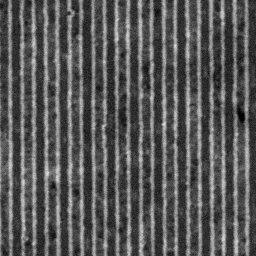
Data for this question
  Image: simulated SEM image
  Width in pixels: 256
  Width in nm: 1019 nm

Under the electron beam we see parallel lines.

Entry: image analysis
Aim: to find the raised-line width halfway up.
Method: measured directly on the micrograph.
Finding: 47.3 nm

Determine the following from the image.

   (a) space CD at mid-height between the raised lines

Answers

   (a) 47.3 nanometers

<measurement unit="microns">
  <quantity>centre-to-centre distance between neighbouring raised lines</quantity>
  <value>0.0942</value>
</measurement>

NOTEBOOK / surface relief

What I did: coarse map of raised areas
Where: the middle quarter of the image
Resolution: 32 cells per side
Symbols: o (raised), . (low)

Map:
.ooo....oo...ooo...ooo...ooo...o
.ooo....oo...ooo...ooo...ooo...o
..oo...ooo...ooo...ooo...ooo...o
..oo...ooo...ooo...ooo...ooo...o
.ooo...ooo...ooo...ooo...ooo...o
.ooo...ooo...ooo...ooo...ooo...o
.ooo...ooo...ooo...ooo...ooo...o
.ooo...ooo...ooo...ooo...ooo...o
.ooo...ooo...ooo...ooo...ooo...o
.ooo...ooo...ooo...ooo...ooo...o
.ooo...ooo...ooo...ooo...ooo...o
.ooo...ooo...ooo...ooo...ooo...o
.ooo...ooo...ooo...ooo...ooo...o
..oo...ooo...ooo...ooo...ooo...o
.ooo...ooo...ooo...ooo...ooo...o
..oo...ooo...ooo...ooo...ooo...o
.ooo...ooo...ooo...ooo...ooo...o
.ooo...ooo...ooo...ooo...ooo...o
.ooo...ooo...ooo...ooo...ooo...o
.ooo...ooo...ooo...ooo...ooo...o
..oo...ooo...ooo...ooo...ooo...o
.ooo...ooo...ooo...ooo...ooo...o
.ooo...ooo...ooo...ooo...ooo...o
.ooo...ooo...ooo...ooo...ooo...o
.ooo...ooo...ooo...ooo...ooo...o
..oo...ooo...ooo...ooo...ooo...o
.ooo...ooo...ooo...ooo...ooo...o
.ooo...ooo...ooo...ooo...ooo...o
..oo...ooo...ooo...ooo...ooo...o
..oo...ooo...ooo...ooo...ooo...o
..oo...ooo...ooo...ooo...ooo...o
..oo...ooo...ooo...ooo...ooo...o